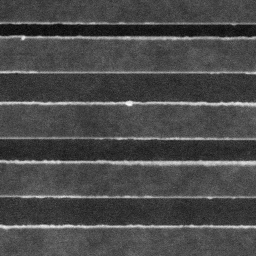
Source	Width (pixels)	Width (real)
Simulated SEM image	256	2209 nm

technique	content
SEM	lines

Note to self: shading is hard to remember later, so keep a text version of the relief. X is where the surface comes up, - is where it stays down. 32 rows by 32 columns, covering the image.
XXXXXXXXXXXXXXXXXXXXXXXXXXXXXXXX
XXXXXXXXXXXXXXXXXXXXXXXXXXXXXXXX
XXXXXXXXXXXXXXXXXXXXXXXXXXXXXXXX
--------------------------------
-XX-----------------------------
XXXXXXXXXXXXXXXXXXXXXXXXXXXXXXXX
XXXXXXXXXXXXXXXXXXXXXXXXXXXXXXXX
XXXXXXXXXXXXXXXXXXXXXXXXXXXXXXXX
XXXXXXXXXXXXXXXXXXXXXXXXXXXXXXXX
--------------------------------
--------------------------------
--------------------------------
--------------------------------
XXXXXXXXXXXXXXXXXXXXXXXXXXXXXXXX
XXXXXXXXXXXXXXXXXXXXXXXXXXXXXXXX
XXXXXXXXXXXXXXXXXXXXXXXXXXXXXXXX
XXXXXXXXXXXXXXXXXXXXXXXXXXXXXXXX
--------------------------------
--------------------------------
--------------------------------
XXXXXXXXXXXXXXXXXXXXXXXXXXXXXXXX
XXXXXXXXXXXXXXXXXXXXXXXXXXXXXXXX
XXXXXXXXXXXXXXXXXXXXXXXXXXXXXXXX
XXXXXXXXXXXXXXXXXXXXXXXXXXXXXXXX
XXXXXXXXXXXXXXXXXXXXXXXXXXXXXXXX
--------------------------------
--------------------------------
--------------------------------
XXXXXXXXXXXXXXXXXXXXXXXXXXXXXXXX
XXXXXXXXXXXXXXXXXXXXXXXXXXXXXXXX
XXXXXXXXXXXXXXXXXXXXXXXXXXXXXXXX
XXXXXXXXXXXXXXXXXXXXXXXXXXXXXXXX